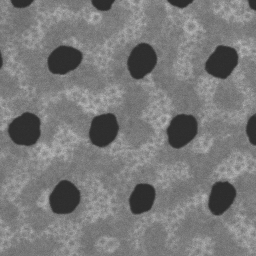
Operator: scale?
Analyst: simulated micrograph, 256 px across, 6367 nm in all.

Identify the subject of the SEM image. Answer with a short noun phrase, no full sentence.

a regular array of holes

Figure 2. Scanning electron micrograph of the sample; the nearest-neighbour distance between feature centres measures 77.8 pixels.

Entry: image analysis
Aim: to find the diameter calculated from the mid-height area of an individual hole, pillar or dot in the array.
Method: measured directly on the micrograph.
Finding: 801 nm